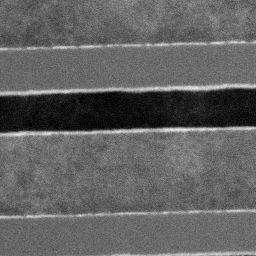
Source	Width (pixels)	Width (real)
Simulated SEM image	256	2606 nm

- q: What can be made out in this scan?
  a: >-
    lines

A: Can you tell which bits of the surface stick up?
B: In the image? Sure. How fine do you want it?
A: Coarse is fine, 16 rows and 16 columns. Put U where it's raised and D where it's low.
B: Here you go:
UUUUUUUUUUUUUUUU
UUUUUUUUUUUUUUUU
UUUUUUUUUUUUUUUU
UUUUUUUUUUUUUUUU
UUUUUUUUUUUUUUUU
UUUUUUUUUUUDDDDD
DDDDDDDDDDDDDDDD
DDDDDDDDDDDDDDDD
UUUUUUUUUUUUUUUU
UUUUUUUUUUUUUUUU
UUUUUUUUUUUUUUUU
UUUUUUUUUUUUUUUU
UUUUUUUUUUUUUUUU
UUUUUUUUUUUUUUUU
UUUUUUUUUUUUUUUU
UUUUUUUUUUUUUUUU